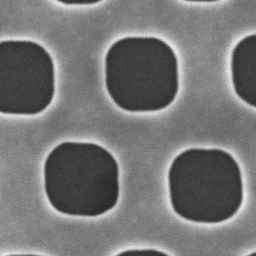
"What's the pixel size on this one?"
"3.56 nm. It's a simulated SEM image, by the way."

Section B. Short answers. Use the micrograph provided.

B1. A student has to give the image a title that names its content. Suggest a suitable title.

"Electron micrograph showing holes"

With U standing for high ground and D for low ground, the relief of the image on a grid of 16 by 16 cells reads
UUUUUUUUUUUUUUUU
UUUUUUUUUUUUUUUU
UUUUUUUUDDUUUUUD
DDDUUUUDDDDUUUUD
DDDUUUUDDDDUUUDD
DDDUUUUDDDDUUUUD
DDDUUUUDDDDUUUUU
UUUUUUUUUUUUUUUU
UUUUUUUUUUUUUUUU
UUUDDDDUUUUDDDUU
UUUDDDDUUUUDDDDU
UUUDDDDUUUUDDDDU
UUUDDDDUUUUDDDDU
UUUUUDUUUUUDDDUU
UUUUUUUUUUUUUUUU
UUUUUUUUUUUUUUUU